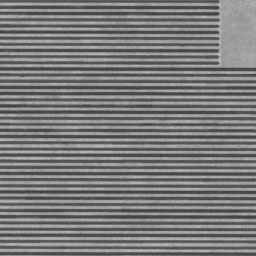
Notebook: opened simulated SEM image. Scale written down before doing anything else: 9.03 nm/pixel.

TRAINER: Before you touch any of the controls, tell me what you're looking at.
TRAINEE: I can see parallel lines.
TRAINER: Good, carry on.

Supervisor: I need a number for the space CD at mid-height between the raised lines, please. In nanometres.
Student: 35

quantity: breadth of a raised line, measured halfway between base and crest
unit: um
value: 0.026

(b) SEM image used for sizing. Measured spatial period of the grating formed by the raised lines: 55.7 nm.